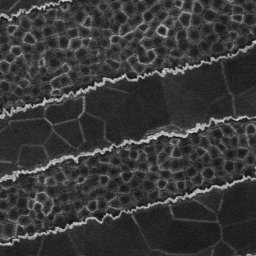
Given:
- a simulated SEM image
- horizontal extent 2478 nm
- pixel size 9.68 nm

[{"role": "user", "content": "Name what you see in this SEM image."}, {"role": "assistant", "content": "one or a few lines or trenches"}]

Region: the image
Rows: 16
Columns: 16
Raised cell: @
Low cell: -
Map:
@@--------------
----------------
----------------
--------------@@
----------@@@@@@
------@@@@@@@@@@
--@@@@@@@@@@@@@@
@@@@@@@@@@@@@@--
@@@@@@@@@@------
@@@@@@----------
@@@-------------
--------------@@
-----------@@@@@
-------@@@@@@@@@
---@@@@@@@@@@@@@
@@@@@@@@@@@@@@@@